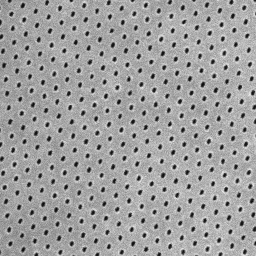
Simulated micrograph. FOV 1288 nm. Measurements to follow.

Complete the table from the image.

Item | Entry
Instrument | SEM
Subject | a regular array of holes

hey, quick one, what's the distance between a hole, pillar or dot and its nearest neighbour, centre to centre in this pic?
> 69.8 nm